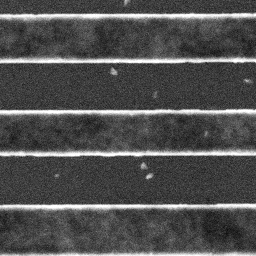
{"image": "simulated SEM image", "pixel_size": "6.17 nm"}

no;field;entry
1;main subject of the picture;lines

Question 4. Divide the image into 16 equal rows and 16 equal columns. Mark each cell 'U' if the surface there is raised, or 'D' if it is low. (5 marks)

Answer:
DDDDDDDDDDDDDDDD
UUUUUUUUUUUUUUUU
UUUUUUUUUUUUUUUU
UUUUUUUUUUUUUUUU
DDDDDDDDDDDDDDDD
DDDDDDDDDDDDDDDD
DDDDDDDDDDDDDDDD
UUUUUUUUUUUUUUUU
UUUUUUUUUUUUUUUU
UUUUUUUUUUUUUUUU
DDDDDDDDDDDDDDDD
DDDDDDDDDDDDDDDD
DDDDDDDDDDDDDDDD
UUUUUUUUUUUUUUUU
UUUUUUUUUUUUUUUU
UUUUUUUUUUUUUUUU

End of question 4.